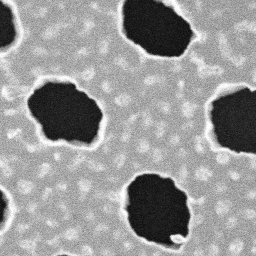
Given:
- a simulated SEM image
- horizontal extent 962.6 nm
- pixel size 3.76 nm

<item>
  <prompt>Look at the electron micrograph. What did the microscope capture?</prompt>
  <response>holes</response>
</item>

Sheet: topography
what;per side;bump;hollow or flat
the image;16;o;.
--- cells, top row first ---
.ooooooo...ooooo
.ooooooo....oooo
.ooooooo....oooo
oooooooooo.ooooo
oooooooooooooooo
oo...ooooooooooo
oo....ooooooo...
oo....ooooooo...
ooo...ooooooo...
ooooooooooooooo.
oooooooooooooooo
oooooooo...ooooo
oooooooo....oooo
oooooooo....oooo
oooooooo....oooo
oooooooooooooooo